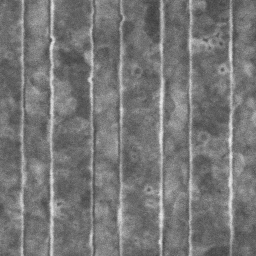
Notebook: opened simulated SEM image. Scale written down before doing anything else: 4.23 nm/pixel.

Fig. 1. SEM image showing one or a few lines or trenches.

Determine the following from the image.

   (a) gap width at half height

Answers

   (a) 118 nanometers